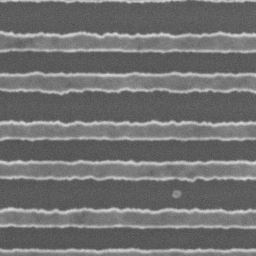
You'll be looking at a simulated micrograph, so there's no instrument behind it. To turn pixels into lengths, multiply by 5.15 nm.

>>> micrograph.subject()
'lines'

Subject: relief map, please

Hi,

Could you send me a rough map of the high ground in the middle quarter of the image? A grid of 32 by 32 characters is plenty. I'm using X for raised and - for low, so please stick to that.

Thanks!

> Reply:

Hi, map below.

--------------------------------
--------------------------------
----------------XXXX------XXXX-X
XXXXXXXXXXXXXXXXXXXXXXXXXXXXXXXX
XXXXXXXXXXXXXXXXXXXXXXXXXXXXXXXX
XXXXXXXXXXXXXXXXXXXXXXXXXXXXXXXX
XXXXX--XXXXXXXX-XXXXXXX-XXXXXXXX
--------------------------------
--------------------------------
--------------------------------
--------------------------------
--------------------------------
--------------------------------
--------------------------------
---X-----------X------XX---X-X-X
XXXXXXXXXXXXXXXXXXXXXXXXXXXXXXXX
XXXXXXXXXXXXXXXXXXXXXXXXXXXXXXXX
XXXXXXXXXXXXXXXXXXXXXXXXXXXXXXXX
XXXXXXXXXXXXXXXXXXXXXXXXXXXXXXXX
--------------------------------
--------------------------------
--------------------------------
--------------------------------
--------------------------------
---XX-----XXXXX-X---------------
XXXXXXXXXXXXXXXXXXXXXXXXXXXXXXXX
XXXXXXXXXXXXXXXXXXXXXXXXXXXXXXXX
XXXXXXXXXXXXXXXXXXXXXXXXXXXXXXXX
XXXXXX-XXXXXXXXXXXXXXXXXXXXXXXXX
--------------------------------
--------------------------------
--------------------------------